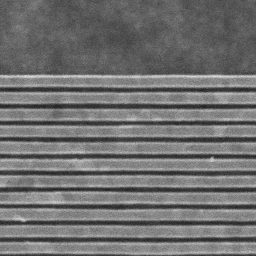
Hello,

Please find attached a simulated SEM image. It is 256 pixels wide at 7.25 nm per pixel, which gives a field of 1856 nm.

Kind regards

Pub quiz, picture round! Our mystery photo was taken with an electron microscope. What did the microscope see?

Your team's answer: parallel lines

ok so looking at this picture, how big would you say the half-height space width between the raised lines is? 48 nanometers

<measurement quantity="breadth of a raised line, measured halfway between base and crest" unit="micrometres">0.0743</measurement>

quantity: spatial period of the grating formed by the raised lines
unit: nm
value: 121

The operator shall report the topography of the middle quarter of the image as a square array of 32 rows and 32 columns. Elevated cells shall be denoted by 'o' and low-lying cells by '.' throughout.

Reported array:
................................
................................
................................
oooooooooooooooooooooooooooooooo
oooooooooooooooooooooooooooooooo
..................o.oo..........
................................
oooooooooooooooooooooooooooooooo
oooooooooooooooooooooooooooooooo
ooooo.....ooooo...oooooooooooooo
................................
................................
oooooooooooooooooooooooooooooooo
oooooooooooooooooooooooooooooooo
................................
................................
oooooooooooooooooooooooooooooooo
oooooooooooooooooooooooooooooooo
................................
................................
oooooooooooooooooooooooooooooooo
oooooooooooooooooooooooooooooooo
................................
................................
oooooooooooooooooooooooooooooooo
oooooooooooooooooooooooooooooooo
................................
................................
oooooooooooooooooooooooooooooooo
oooooooooooooooooooooooooooooooo
oooooooooooooooooooooooooooooooo
................................